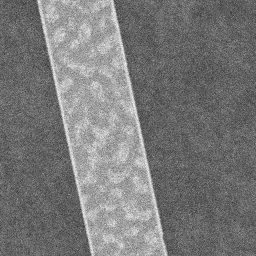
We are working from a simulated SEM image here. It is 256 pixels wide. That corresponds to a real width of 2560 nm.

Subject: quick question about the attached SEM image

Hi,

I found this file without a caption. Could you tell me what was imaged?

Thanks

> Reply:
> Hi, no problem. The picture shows one or a few lines or trenches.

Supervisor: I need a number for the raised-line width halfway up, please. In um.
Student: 0.728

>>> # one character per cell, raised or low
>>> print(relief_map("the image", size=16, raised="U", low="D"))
DDUUUUUDDDDDDDDD
DDDUUUUDDDDDDDDD
DDDUUUUUDDDDDDDD
DDDUUUUUDDDDDDDD
DDDUUUUUDDDDDDDD
DDDDUUUUDDDDDDDD
DDDDUUUUDDDDDDDD
DDDDUUUUUDDDDDDD
DDDDUUUUUDDDDDDD
DDDDUUUUUDDDDDDD
DDDDDUUUUDDDDDDD
DDDDDUUUUDDDDDDD
DDDDDUUUUUDDDDDD
DDDDDUUUUUDDDDDD
DDDDDUUUUUDDDDDD
DDDDDDUUUUDDDDDD